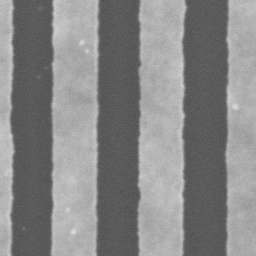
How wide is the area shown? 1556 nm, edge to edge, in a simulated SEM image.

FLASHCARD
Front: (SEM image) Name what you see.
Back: lines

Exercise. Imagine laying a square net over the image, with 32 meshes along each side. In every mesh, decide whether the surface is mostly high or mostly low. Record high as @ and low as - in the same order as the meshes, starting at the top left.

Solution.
@@-----@@@@@------@@@@@------@@@
@@-----@@@@@-----@@@@@@------@@@
@@-----@@@@@-----@@@@@@------@@@
@@-----@@@@@------@@@@@------@@@
@@-----@@@@@------@@@@@-----@@@@
@@-----@@@@@------@@@@@------@@@
@@-----@@@@@------@@@@@------@@@
@@-----@@@@@------@@@@@------@@@
@@-----@@@@@------@@@@@------@@@
@@-----@@@@@-----@@@@@@------@@@
@------@@@@@------@@@@@------@@@
@------@@@@@------@@@@@-----@@@@
@------@@@@@------@@@@@-----@@@@
@------@@@@@------@@@@@-----@@@@
@------@@@@@------@@@@@-----@@@@
@------@@@@@------@@@@@------@@@
@------@@@@@------@@@@@------@@@
@@-----@@@@@-----@@@@@@-----@@@@
@@-----@@@@@-----@@@@@@-----@@@@
@@-----@@@@@-----@@@@@@-----@@@@
@@-----@@@@@-----@@@@@@-----@@@@
@@-----@@@@@-----@@@@@@-----@@@@
@@-----@@@@@-----@@@@@@------@@@
@------@@@@@-----@@@@@@-----@@@@
@@-----@@@@@------@@@@@------@@@
@@-----@@@@@-----@@@@@@-----@@@@
@------@@@@@-----@@@@@@------@@@
@------@@@@@-----@@@@@@-----@@@@
@------@@@@@-----@@@@@@-----@@@@
@------@@@@@-----@@@@@@------@@@
@------@@@@@-----@@@@@@-----@@@@
@-----@@@@@@-----@@@@@@-----@@@@